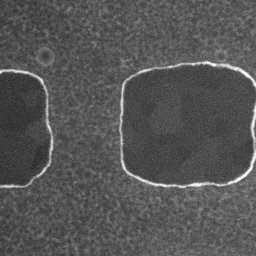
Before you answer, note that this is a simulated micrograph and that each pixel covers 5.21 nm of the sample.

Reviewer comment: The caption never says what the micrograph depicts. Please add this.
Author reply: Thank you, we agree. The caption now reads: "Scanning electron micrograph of raised bodies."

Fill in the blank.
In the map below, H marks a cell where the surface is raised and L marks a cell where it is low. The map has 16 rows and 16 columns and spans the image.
LLLLLLLLLLLLLLLL
LLLLLLLLLLLLLLLL
LLLLLLLLLLLLLLLL
LLLLLLLLLLLLLLLL
HHLLLLLLLHHHHHHL
HHHLLLLLHHHHHHHH
HHHLLLLLHHHHHHHH
HHHLLLLLHHHHHHHH
HHHLLLLLHHHHHHHH
HHHLLLLLHHHHHHHH
HHHLLLLLHHHHHHHH
HHLLLLLLLLHHHHLL
LLLLLLLLLLLLLLLL
LLLLLLLLLLLLLLLL
LLLLLLLLLLLLLLLL
LLLLLLLLLLLLLLLL